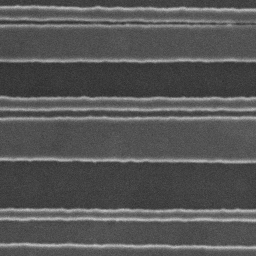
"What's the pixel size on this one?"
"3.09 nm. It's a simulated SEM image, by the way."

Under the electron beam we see lines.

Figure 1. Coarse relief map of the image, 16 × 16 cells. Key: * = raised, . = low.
*******.........
****************
****************
****************
................
................
****************
****************
****************
****************
................
................
................
****************
****************
****************